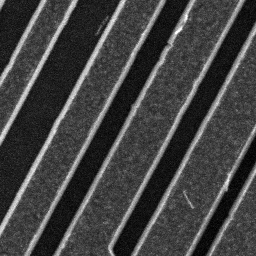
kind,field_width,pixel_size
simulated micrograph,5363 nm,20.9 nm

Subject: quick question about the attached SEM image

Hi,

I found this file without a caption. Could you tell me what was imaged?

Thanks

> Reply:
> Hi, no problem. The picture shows one or a few lines or trenches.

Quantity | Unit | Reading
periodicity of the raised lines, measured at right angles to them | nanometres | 1430